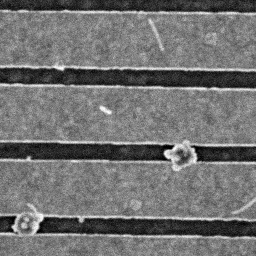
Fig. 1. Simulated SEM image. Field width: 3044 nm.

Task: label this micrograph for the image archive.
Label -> lines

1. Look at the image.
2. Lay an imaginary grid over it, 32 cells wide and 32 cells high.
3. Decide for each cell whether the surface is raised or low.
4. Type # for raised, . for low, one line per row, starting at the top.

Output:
................................
#############.###...............
################################
################################
################################
################################
################################
################################
.......#..######################
................................
................................
################################
################################
################################
################################
################################
################################
################################
......................##........
.....................###........
################################
################################
################################
################################
################################
################################
################################
..###...........................
..###...........................
###############.................
################################
################################